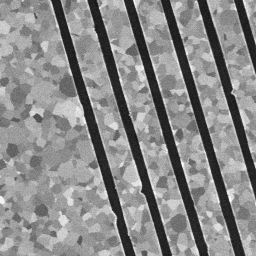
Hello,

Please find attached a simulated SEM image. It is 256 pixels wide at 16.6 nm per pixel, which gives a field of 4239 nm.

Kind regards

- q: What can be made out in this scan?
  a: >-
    parallel lines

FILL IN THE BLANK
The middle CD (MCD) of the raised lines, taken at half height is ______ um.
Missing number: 0.421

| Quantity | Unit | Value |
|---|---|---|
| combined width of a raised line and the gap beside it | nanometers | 582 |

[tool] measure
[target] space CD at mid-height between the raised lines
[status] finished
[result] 0.167 um